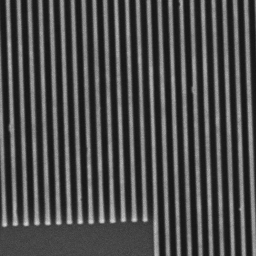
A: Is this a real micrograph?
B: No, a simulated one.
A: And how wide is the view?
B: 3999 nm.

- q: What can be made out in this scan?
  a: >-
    parallel lines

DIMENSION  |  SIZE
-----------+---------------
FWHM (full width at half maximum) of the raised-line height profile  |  66.3 nm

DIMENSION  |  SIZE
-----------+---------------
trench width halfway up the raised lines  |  0.107 micrometres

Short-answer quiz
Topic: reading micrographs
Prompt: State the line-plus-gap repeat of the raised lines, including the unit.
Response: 169 nm